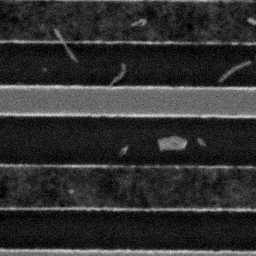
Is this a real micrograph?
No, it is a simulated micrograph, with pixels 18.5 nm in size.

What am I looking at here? lines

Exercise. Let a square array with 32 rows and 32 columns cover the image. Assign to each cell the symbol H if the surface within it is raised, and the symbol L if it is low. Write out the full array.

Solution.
HHHHHHHHHHHHHHHHHHHHHHHHHHHHHHHH
HHHHHHHHHHHHHHHHHHHHHHHHHHHHHHHH
HHHHHHHHHHHHHHHHHHHHHHHHHHHHHHHH
HHHHHHHHHHHHHHHHHHHHHHHHHHHHHHHH
HHHHHHHHHHHHHHHHHHHHHHHHHHHHHHHH
LLLLLLLLLLLLLLLLLLLLLLLLLLLLLLLL
LLLLLLLLLLLLLLLLLLLLLLLLLLLLLLLL
LLLLLLLLLLLLLLLLLLLLLLLLLLLLLLLL
LLLLLLLLLLLLLLLLLLLLLLLLLLLLLLLL
LLLLLLLLLLLLLLLLLLLLLLLLLLLLLLLL
LLLLLLLLLLLLLLLLLLLLLLLLLLLLLLLL
HHHHHHHHHHHHHHHHHHHHHHHHHHHHHHHH
HHHHHHHHHHHHHHHHHHHHHHHHHHHHHHHH
HHHHHHHHHHHHHHHHHHHHHHHHHHHHHHHH
LLLLLLLLLLLLLLLLHHHHHHHHHHHHHHHH
LLLLLLLLLLLLLLLLLLLLLLLLLLLLLLLL
LLLLLLLLLLLLLLLLLLLLLLLLLLLLLLLL
LLLLLLLLLLLLLLLLLLLLLLLLLLLLLLLL
LLLLLLLLLLLLLLLLLLLLLLLLLLLLLLLL
LLLLLLLLLLLLLLLLLLLLLLLLLLLLLLLL
LLLLLLLLLLLLLLLLLLLLLLLLLLLLLLLL
HHHHHHHHHHHHHHHHHHHHHHHHHHHHHHHH
HHHHHHHHHHHHHHHHHHHHHHHHHHHHHHHH
HHHHHHHHHHHHHHHHHHHHHHHHHHHHHHHH
HHHHHHHHHHHHHHHHHHHHHHHHHHHHHHHH
HHHHHHHHHHHHHHHHHHHHHHHHHHHHHHHH
LLLLLLLLLLLLLLLLLLLLLLLLLLLLLLLL
LLLLLLLLLLLLLLLLLLLLLLLLLLLLLLLL
LLLLLLLLLLLLLLLLLLLLLLLLLLLLLLLL
LLLLLLLLLLLLLLLLLLLLLLLLLLLLLLLL
LLLLLLLLLLLLLLLLLLLLLLLLLLLLLLLL
HHHHHHHHHHHHHHHHHHHHHHHHHLLHHLLL